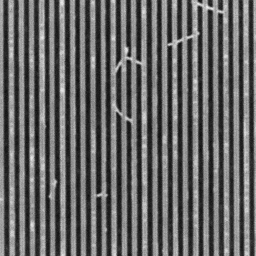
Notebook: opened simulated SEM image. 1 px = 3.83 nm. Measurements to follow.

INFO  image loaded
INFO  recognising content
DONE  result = parallel lines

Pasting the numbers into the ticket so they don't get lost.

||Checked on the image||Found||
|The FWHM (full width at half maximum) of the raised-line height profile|0.0182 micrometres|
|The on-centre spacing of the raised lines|39.1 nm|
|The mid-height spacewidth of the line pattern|22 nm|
